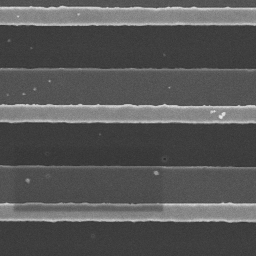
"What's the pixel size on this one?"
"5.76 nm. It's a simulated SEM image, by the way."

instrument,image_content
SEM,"lines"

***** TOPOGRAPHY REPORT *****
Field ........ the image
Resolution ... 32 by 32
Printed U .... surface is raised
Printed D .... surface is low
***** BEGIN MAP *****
UUUUUUUUUUUUUUUUUUUUUUUUUUUUUUUU
UUUUUUUUUUUUUUUUUUUUUUUUUUUUUUUU
UUUUUUUUUUUUUUUUUUUUUUUUUUUUUUUU
DDDDDDDDDDDDDDDDDDDDDDDDDDDDDDDD
DDDDDDDDDDDDDDDDDDDDDDDDDDDDDDDD
DDDDDDDDDDDDDDDDDDDDDDDDDDDDDDDD
DDDDDDDDDDDDDDDDDDDDDDDDDDDDDDDD
DDDDDDDDDDDDDDDDDDDDDDDDDDDDDDDD
DDDDDDDDDDDDDDDDDDDDDDDDDDDDDDDD
UUUUUUUUUUUUUUUUUUUUUUUUUUUUUUUU
UUUUUUUUUUUUUUUUUUUUUUUUUUUUUUUU
UUUUUUUUUUUUUUUUUUUUUUUUUUUUUUUU
UUUUUUUUUUUUUUUUUUUUUUUUUUUUUUUU
UUUUUUUUUUUUUUUUUUUUUUUUUUUUUUUU
UUUUUUUUUUUUUUUUUUUUUUUUUUUUUUUU
DDDDDDDDDDDDDDDDDDDDDDDDDDDDDDDD
DDDDDDDDDDDDDDDDDDDDDDDDDDDDDDDD
DDDDDDDDDDDDDDDDDDDDDDDDDDDDDDDD
DDDDDDDDDDDDDDDDDDDDDDDDDDDDDDDD
DDDDDDDDDDDDDDDDDDDDDDDDDDDDDDDD
DDDDDDDDDDDDDDDDDDDDDDDDDDDDDDDD
UUUUUUUUUUUUUUUUUUUUUUUUUUUUUUUU
UUUUUUUUUUUUUUUUUUUUUUUUUUUUUUUU
UUUUUUUUUUUUUUUUUUUUUUUUUUUUUUUU
UUUUUUUUUUUUUUUUUUUUUUUUUUUUUUUU
UUUUUUUUUUUUUUUUUUUUUUUUUUUUUUUU
UUUUUUUUUUUUUUUUUUUUUUUUUUUUUUUU
UUUUUUUUUUUUUUUUUUUUUUUUUUUUUUUU
DDDDDDDDDDDDDDDDDDDDDDDDDDDDDDDD
DDDDDDDDDDDDDDDDDDDDDDDDDDDDDDDD
DDDDDDDDDDDDDDDDDDDDDDDDDDDDDDDD
DDDDDDDDDDDDDDDDDDDDDDDDDDDDDDDD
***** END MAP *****